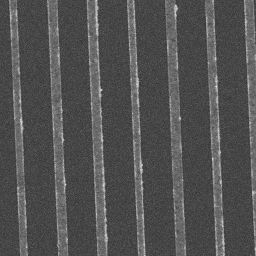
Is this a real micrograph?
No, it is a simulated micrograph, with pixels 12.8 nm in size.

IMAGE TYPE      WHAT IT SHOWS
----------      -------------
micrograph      parallel lines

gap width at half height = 30.5 pixels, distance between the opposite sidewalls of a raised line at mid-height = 9.12 px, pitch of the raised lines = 502 nm